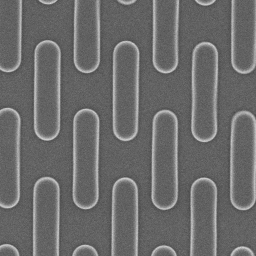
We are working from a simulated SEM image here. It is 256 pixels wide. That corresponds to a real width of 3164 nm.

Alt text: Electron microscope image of groups of lines, slits or small figures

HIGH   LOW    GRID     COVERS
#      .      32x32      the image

###......###.......###...#...###
###......###.......###.......###
###......###.......###.......###
###......###.......###.......###
###......###.......###.......###
###..##..###...##..###...#...###
###.###..###..###..###..###..###
###.###..###..###..###..###..###
##..###...##..###...##..###..###
....###.......###.......###.....
....###.......###.......###.....
....###.......###.......###.....
....###.......###.......###.....
....###.......###.......###.....
##..###..###..###..###..###..###
##..###..###..###..###..###..###
##..###..###..###..###..###..###
##.......###...#...###...#...###
##.......###.......###.......###
##.......###.......###.......###
##.......###.......###.......###
##.......###.......###.......###
##...##..###...#...###...#...###
##..###..###..###..###..###..###
##..###..###..###..###..###..###
##..###...##..###..###..###..###
....###.......###.......###.....
....###.......###.......###.....
....###.......###.......###.....
....###.......###.......###.....
....###.......###.......###.....
##..###..###..###..###..###..##.